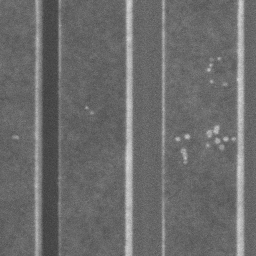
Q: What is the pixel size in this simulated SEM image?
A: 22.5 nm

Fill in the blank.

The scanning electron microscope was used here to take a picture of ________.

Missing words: lines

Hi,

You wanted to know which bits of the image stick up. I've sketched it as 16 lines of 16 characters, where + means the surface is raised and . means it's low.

++..++++..+++++.
++..++++..+++++.
++..++++..+++++.
++..++++..+++++.
++..++++..+++++.
++..++++..+++++.
++..++++..+++++.
++..++++..+++++.
++..++++..+++++.
++..++++..+++++.
++..++++..+++++.
++..++++..+++++.
++..++++..+++++.
++..++++..+++++.
++..++++..+++++.
++..++++..+++++.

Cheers